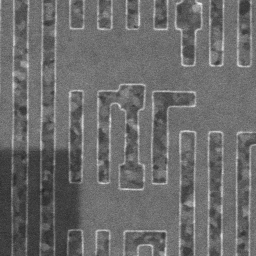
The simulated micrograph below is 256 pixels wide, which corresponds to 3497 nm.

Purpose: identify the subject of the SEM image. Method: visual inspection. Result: wiring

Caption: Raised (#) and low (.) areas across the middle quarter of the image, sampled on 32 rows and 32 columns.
................................
................................
................................
................................
................................
..............######............
.............#######............
.####....###########..##########
.####....###########..##########
.####....###########..##########
.####....###..######..##########
.####....###...####...####......
.####....###...####...####......
.####....###...###....####......
.####....###...###....####......
.####....###...####...####......
.####....##....####...####......
.####....##....####...####...###
.####...###....####...####...###
.####...###....####...####...###
.####...###....####...####...###
.####...###....####...####...###
.###....###....####...####...###
.###....###....####...####...###
.###....###....####...####...###
.###....###...######..####...###
.###.....##...######..####...###
.###.....##...######..####...###
.###.....##...######..####...###
..##.....##...######..####...###
..............######.........###
.............................###